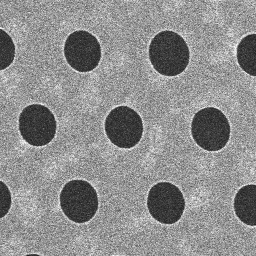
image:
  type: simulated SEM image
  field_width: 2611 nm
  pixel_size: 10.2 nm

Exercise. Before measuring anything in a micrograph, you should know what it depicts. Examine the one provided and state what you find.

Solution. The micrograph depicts holes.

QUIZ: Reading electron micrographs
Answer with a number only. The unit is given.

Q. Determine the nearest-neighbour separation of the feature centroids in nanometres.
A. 880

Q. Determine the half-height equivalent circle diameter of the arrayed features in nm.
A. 412